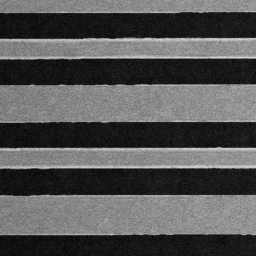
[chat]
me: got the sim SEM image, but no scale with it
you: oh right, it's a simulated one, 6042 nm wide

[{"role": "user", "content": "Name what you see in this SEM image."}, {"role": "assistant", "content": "lines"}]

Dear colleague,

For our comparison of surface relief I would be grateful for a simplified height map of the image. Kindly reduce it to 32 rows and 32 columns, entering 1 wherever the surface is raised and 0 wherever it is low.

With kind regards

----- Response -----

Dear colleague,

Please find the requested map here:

11111111111111111111111111111111
11111111111111111111111001000000
00000000000000000000000000000000
00000000000000000000000000000000
00000000000000000000000000000000
11111111111111111111111111111111
11111111111111111111111111111111
00000000000000000000000000000000
00000000000000000000000000000000
00000000000000000000000000000000
00000000000000000000000000000000
11111111111111111111111111111111
11111111111111111111111111111111
11111111111111111111111111111111
11111111111111111111111111111111
00000000000000000000000000000000
00000000000000000000000000000000
00000000000000000000000000000000
00000000000000000000000000000000
11111111111111111111111111111111
11111111111111111111111111111111
00000000000000000000000000000000
00000000000000000000000000000000
00000000000000000000000000000000
10011111111111111111111111111111
11111111111111111111111111111111
11111111111111111111111111111111
11111111111111111111111111111111
11111111111111111111111111111111
00000000000000000000000000000000
00000000000000000000000000000000
00000000000000000000000000000000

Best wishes